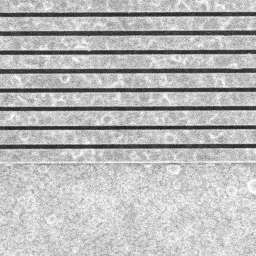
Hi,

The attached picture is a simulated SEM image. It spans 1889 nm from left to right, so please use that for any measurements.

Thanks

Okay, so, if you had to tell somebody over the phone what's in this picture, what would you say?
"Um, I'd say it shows parallel lines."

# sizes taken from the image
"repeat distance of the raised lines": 139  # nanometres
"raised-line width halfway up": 104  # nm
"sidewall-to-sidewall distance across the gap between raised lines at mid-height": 0.0323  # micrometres